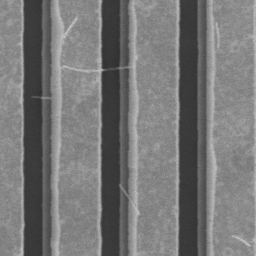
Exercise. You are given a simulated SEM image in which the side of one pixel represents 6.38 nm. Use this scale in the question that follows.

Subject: lines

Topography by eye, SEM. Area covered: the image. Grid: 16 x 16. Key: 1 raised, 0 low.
1001110011100111
1001110011100111
1001110011100111
1001110011100111
1001110011100111
1001110011100111
1001110011100111
1001110011100111
1001110011100111
1001110011100111
1001110011100111
1001110011100111
1001110011100111
1101110011100111
1101110011100111
1001110011100111